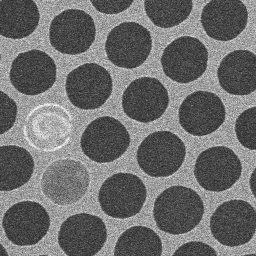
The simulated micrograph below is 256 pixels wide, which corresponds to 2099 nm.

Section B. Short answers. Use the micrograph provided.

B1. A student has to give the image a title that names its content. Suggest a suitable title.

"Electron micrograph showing a regular array of holes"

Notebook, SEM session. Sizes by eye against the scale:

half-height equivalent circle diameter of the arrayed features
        384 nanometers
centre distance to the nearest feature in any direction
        0.463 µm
